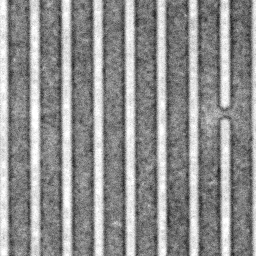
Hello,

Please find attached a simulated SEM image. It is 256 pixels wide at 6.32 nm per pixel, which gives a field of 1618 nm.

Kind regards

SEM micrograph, parallel lines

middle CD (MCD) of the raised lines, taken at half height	0.0474	microns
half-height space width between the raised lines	0.155	microns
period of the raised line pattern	0.2	micrometres